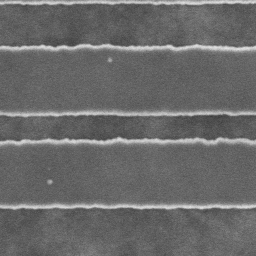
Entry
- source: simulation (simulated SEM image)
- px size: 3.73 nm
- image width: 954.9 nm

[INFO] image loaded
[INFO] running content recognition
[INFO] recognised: lines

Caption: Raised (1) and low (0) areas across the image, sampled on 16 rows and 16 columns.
0000000000000000
0000000000000000
0000000000000000
1111111111111111
1111111111111111
1111111111111111
1111111111111111
0000000000000000
0000000000000000
1111111111111111
1111111111111111
1111111111111111
1111111111111111
0000000000000000
0000000000000000
0000000000000000